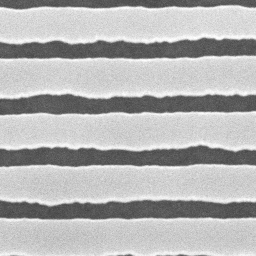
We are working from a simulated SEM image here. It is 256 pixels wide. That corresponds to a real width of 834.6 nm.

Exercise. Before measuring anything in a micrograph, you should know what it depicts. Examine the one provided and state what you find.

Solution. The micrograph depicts lines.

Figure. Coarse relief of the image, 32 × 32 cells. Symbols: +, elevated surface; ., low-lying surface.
................................
++++++++++++++++++++++++++++++++
++++++++++++++++++++++++++++++++
++++++++++++++++++++++++++++++++
++++++++++++++++++++++++++++++++
................................
................................
++++++++++++++++++++++++++++++++
++++++++++++++++++++++++++++++++
++++++++++++++++++++++++++++++++
++++++++++++++++++++++++++++++++
++++++++++++++++++++++++++++++++
................................
................................
++++++++++++++++++++++++++++++++
++++++++++++++++++++++++++++++++
++++++++++++++++++++++++++++++++
++++++++++++++++++++++++++++++++
+++++....++++++++++++++....+++++
................................
................................
++++++++++++++++++++++++++++++++
++++++++++++++++++++++++++++++++
++++++++++++++++++++++++++++++++
++++++++++++++++++++++++++++++++
.....+++........................
................................
+++++....++..+++++++++++++++++++
++++++++++++++++++++++++++++++++
++++++++++++++++++++++++++++++++
++++++++++++++++++++++++++++++++
++++++++++++++++++++++++++++++++